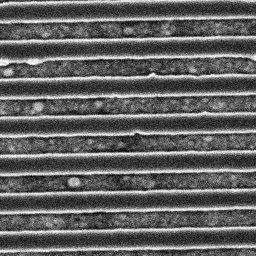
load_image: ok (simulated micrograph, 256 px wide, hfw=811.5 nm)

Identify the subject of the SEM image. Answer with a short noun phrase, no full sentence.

parallel lines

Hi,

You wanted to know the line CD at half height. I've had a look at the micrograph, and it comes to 0.063 um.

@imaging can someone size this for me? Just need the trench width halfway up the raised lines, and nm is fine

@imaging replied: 57.1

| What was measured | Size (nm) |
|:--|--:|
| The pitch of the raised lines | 121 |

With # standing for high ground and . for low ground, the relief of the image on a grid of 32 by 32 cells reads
################################
################################
##################..............
................................
................................
################################
################################
######..........................
................................
..................##..##..######
################################
################################
................................
................................
...........#.###################
################################
################################
................................
................................
################################
################################
####################..#.........
.........#......................
................................
################################
################################
##########......................
................................
.......................#.....###
################################
################################
................................